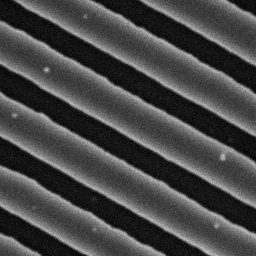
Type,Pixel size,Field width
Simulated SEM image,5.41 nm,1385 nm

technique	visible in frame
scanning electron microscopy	lines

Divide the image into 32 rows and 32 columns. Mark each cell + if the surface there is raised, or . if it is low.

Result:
...+++++++++......+++++++++++...
....++++++++++......+++++++++++.
......++++++++++......++++++++++
++......+++++++++.......++++++++
++++......+++++++++......+++++++
++++++.....++++++++++......+++++
+++++++......++++++++++......+++
+++++++++......++++++++++......+
.++++++++++......+++++++++......
...++++++++++......+++++++++....
.....+++++++++......++++++++++..
......++++++++++......++++++++++
++......++++++++++......++++++++
++++......++++++++++......++++++
++++++.....++++++++++......+++++
+++++++......++++++++++......+++
+++++++++......++++++++++......+
.++++++++++......++++++++++.....
...+++++++++.......++++++++++...
....++++++++++......+++++++++++.
......++++++++++......++++++++++
++......++++++++++......++++++++
++++......++++++++++......++++++
+++++......++++++++++.......++++
+++++++......++++++++++......+++
+++++++++......++++++++++......+
.++++++++++......+++++++++......
...++++++++++......+++++++++....
.....+++++++++......++++++++++..
+......+++++++++......++++++++++
++......++++++++++......++++++++
++++......++++++++++......++++++